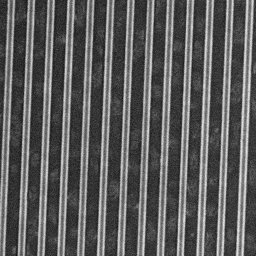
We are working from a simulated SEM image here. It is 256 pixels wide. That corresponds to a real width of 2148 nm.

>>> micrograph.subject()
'parallel lines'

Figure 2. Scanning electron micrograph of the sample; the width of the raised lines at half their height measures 51.3 nanometers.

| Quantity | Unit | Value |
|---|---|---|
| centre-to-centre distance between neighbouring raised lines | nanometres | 167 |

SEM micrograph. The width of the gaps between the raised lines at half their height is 118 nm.